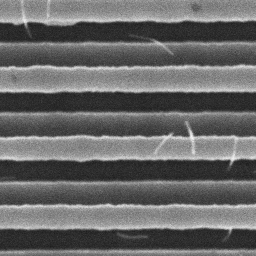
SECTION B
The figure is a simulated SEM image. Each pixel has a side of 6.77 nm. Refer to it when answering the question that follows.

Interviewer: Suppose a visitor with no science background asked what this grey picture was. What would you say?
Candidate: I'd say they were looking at lines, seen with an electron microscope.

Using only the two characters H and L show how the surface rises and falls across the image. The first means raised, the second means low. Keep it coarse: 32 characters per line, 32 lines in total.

HHHHHHHHHHHHHHHHHHHHHHHHHHHHHHHH
HHHHHHHHHHHHHHHHHHHHHHHHHHHHHHHH
HHHHHHHHHHHHHHHHHHHHHHHLHHHHHHHL
LLLLLLLLLLLLLLLLLLLLLLLLLLLLLLLL
LLLLLLLLLLLLLLLLLLLLLLLLLLLLLLLL
HLLLLHHLHLHHHHHHHLLHHHHHHHHHHHHH
HHHHHHHHHHHHHHHHHHHHHHHHHHHHHHHH
HHHHHHHHHHHHHHHHHHHHHHHHHHHHHHHH
HHHHHHHHHHHHHHHHHHHHHHHHHHHHHHHH
HHHHHHHHHHHHHHHHHHHHHHHHHHHHHHHH
HHHHHHHHHHHHHHHHHHHHHHHHHHHHHHHH
LLLLLHHLLLLLLLLLLHLLLLLLLLLLLLLL
LLLLLLLLLLLLLLLLLLLLLLLLLLLLLLLL
LLLLLLLLLLLLLLLLLLLLLLLLLLLLLLLL
HHHHHHHHHHHHHHHHHHHHHHHHHHHHHHHH
HHHHHHHHHHHHHHHHHHHHHHHHHHHHHHHH
HHHHHHHHHHHHHHHHHHHHHHHHHHHHHHHH
HHHHHHHHHHHHHHHHHHHHHHHHHHHHHHHH
HHHHHHHHHHHHHHHHHHHHHHHHHHHHHHHH
HHHHHHHHHHHHHHHHHHHHHHHHHHHHHHHH
LLLLLLLLLLLLLLLLLLLLLLLLLLLLLLLL
LLLLLLLLLLLLLLLLLLLLLLLLLLLLLLLL
LLLLLLLLLLLLLLLLLLLLLLLLLLLLLLLL
HHHHHHHHHHHHHHHHHHHHHHHHHHHHHHHH
HHHHHHHHHHHHHHHHHHHHHHHHHHHHHHHH
HHHHHHHHHHHHHHHHHHHHHHHHHHHHHHHH
HHHHHHHHHHHHHHHHHHHHHHHHHHHHHHHH
HHHHHHHHHHHHHHHHHHHHHHHHHHHHHHHH
HHHHHHHHHHHHHHHHHHHHHHHHHLHHHHHH
LLLLLLLLLLLLLLLLLLLLLLLLLLLLLLLL
LLLLLLLLLLLLLLLLLLLLLLLLLLLLLLLL
LLLLLLLLLLHLLLLHLLHHHHLHHHHHHHHH